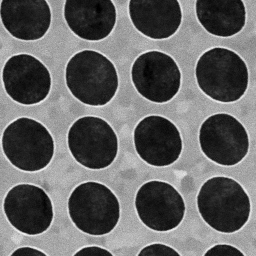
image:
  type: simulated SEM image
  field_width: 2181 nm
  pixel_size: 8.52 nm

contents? a regular array of holes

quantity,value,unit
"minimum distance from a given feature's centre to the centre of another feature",550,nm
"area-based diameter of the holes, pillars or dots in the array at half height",436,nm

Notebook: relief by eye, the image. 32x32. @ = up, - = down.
------@@------@@------@@@-----@@
------@@------@@-------@@------@
------@@-------@-------@@------@
@-----@@@-----@@@-----@@@@----@@
@@---@@@@@---@@@@@---@@@@@@--@@@
@@@@@@@@@@@@@@@@@@@@@@@@@@@@@@@@
@@@@@@@@@@--@@@@@@--@@@@@@---@@@
@----@@@@-----@@@-----@@@-----@@
------@@------@@------@@-------@
------@@-------@-------@-------@
------@@-------@@------@@------@
@-----@@@-----@@@-----@@@------@
@@---@@@@@----@@@@@--@@@@@@---@@
@@@@@@@@@@@@@@@@@@@@@@@@@@@@@@@@
@@@@@@@@@@@@@@@@@@@-@@@@@@---@@@
@----@@@@-----@@@-----@@@-----@@
------@@@-----@@@-----@@@------@
-------@-------@@------@@------@
-------@@------@@------@@------@
@------@@------@@-----@@@@-----@
@@----@@@@----@@@@@--@@@@@@---@@
@@@@@@@@@@@@@@@@@@@@@@@@@@@@@@@@
@@@@@@@@@@@@@@@@@@@@@@@@@@---@@@
@@---@@@@----@@@@@----@@@-----@@
@-----@@@-----@@@------@@------@
------@@@------@@------@@------@
@------@@------@@------@@------@
@-----@@@------@@@-----@@@-----@
@@----@@@@----@@@@@---@@@@@---@@
@@@@@@@@@@@@@@@@@@@@@@@@@@@@@@@@
@@@@@@@@@@@@@@@@@@@-@@@@@@@@@@@@
@@---@@@@@----@@@-----@@@@----@@